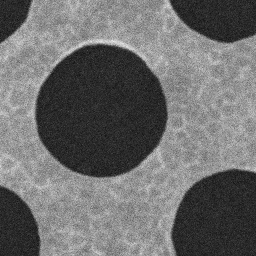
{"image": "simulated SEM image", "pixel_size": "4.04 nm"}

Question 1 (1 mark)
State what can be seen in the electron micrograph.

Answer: holes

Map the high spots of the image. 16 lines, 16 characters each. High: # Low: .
..#########.....
.###########....
#############..#
####.....#######
###.......######
###.......######
##........######
##........######
##........######
###.......######
####....########
############....
.##########.....
..#########.....
..#########.....
...########.....